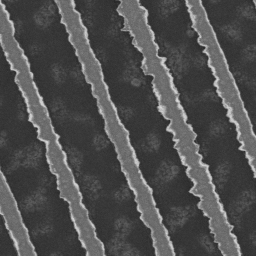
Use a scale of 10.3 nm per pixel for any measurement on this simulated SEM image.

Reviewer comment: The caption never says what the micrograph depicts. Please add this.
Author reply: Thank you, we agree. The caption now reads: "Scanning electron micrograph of one or a few lines or trenches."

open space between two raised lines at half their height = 463 nanometers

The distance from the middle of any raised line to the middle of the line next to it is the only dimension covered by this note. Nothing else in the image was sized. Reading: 0.637 micrometres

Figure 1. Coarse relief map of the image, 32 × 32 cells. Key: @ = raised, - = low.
-------@@------@@------@@-------
@-------@@-----@@@------@@------
@-------@@------@@------@@------
@@------@@@----@@@@-----@@------
@@-------@@------@@------@@-----
@@-------@@------@@------@@-----
-@@-------@@------@@------@@----
-@@-------@@------@@------@@----
--@@------@@@-----@@@-----@@----
--@@-------@@------@@------@@---
--@@-------@@------@@------@@---
---@@-------@------@@@-----@@@--
---@@-------@@------@@------@@--
----@@------@@------@@@-----@@--
----@@-------@@------@@------@@-
----@@-------@@------@@-------@-
-----@@------@@@------@@------@@
-----@@-------@@------@@------@@
------@@------@@------@@@-----@@
------@@-------@@------@@------@
------@@-------@@------@@------@
-------@@------@@@-----@@@------
@------@@-------@@------@@------
@------@@@-------@@-----@@@-----
@@------@@-------@@------@@-----
@@-------@-------@@------@@-----
@@-------@@-------@@-----@@@----
-@@------@@-------@@------@@----
-@@-------@@-------@@-----@@@---
--@@------@@-------@@------@@---
--@@------@@@------@@------@@@--
--@@-------@@-------@@------@@--